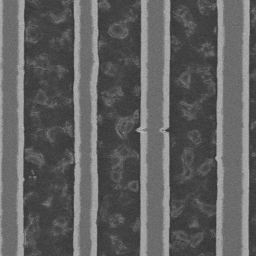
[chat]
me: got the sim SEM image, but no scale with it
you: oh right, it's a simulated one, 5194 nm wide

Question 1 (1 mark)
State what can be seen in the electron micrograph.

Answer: one or a few lines or trenches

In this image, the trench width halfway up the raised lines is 1060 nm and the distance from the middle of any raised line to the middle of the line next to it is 73.6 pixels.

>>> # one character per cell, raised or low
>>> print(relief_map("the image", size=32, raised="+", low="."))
+++.......++......+++......++++.
+++.......++......+++......++++.
+++.......++......+++......++++.
+++.......++......+++......++++.
+++.......++......+++......++++.
+++......+++......+++......++++.
+++......+++......+++......++++.
+++......+++......+++......++++.
+++......+++......+++......++++.
+++......+++......+++......++++.
+++......+++......+++......++++.
+++......+++......+++......++++.
+++......+++......+++......++++.
+++.......++......+++......++++.
+++......+++......+++......++++.
+++.......++......+++......++++.
+++.......++......+++......++++.
+++.......++......+++......++++.
+++.......++......+++......++++.
+++.......++......+++......++++.
+++.......++......+++......++++.
+++.......++......+++......++++.
+++.......++......+++.......+++.
+++.......++......+++.......+++.
+++.......++......+++......++++.
+++.......++......+++......++++.
+++.......++......+++......++++.
+++.......++......+++......++++.
+++......+++......+++......++++.
+++......+++......+++......++++.
+++......+++......+++......++++.
+++......+++......+++......++++.